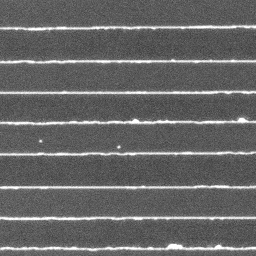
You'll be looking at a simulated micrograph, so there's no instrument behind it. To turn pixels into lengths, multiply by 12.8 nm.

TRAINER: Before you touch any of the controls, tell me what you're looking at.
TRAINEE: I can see lines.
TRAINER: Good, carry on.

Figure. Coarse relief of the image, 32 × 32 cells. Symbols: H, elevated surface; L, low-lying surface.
HHHHHHHHHHHHHHHHHHHHHHHHHHHHHHHH
HHHHHHHHHHHHHHHHHHHHHHHHHHHHHHHH
HHHHHHHHHHHHHHHHHHHHHHHHHHHHHHHH
HHHHHHHHHHHHHHHHHLLHLLLLLLLLLLLL
LLLLLLLLLLLLLLLLLLLLLLLLLLLLLLLL
LLLLLLLLLLLLLLLLLLLLLLLLLLLLLLLL
LLLLLLLLLLLLLLLLLLLLLLLLLLLLLLLL
LLLLLLLLLLLLLLLLLLLLLLLLLLLLLLLL
HHHHHHHHHHHHHHHHHHHHHHHHHHHHHHHH
HHHHHHHHHHHHHHHHHHHHHHHHHHHHHHHH
HHHHHHHHHHHHHHHHHHHHHHHHHHHHHHHH
HHHHHHHHHHHHHHHHHHHHHHHHHHHHHLHH
LLLLLLLLLLLLLLLLLLLLLLLLLLLLLLLL
LLLLLLLLLLLLLLLLLLLLLLLLLLLLLLLL
LLLLLLLLLLLLLLLLLLLLLLLLLLLLLLLL
HHHHHHHHHHHHHHHHHHHHHHHHHHHHHHHH
HHHHHHHHHHHHHHHHHHHHHHHHHHHHHHHH
HHHHHHHHHHHHHHHHHHHHHHHHHHHHHHHH
HHHHHHHHHHHHHHHHHHHHHHHHHHHHHHHH
LLLLLLLLLLLLLLLLLLLLLLLLLLLLLLLL
LLLLLLLLLLLLLLLLLLLLLLLLLLLLLLLL
LLLLLLLLLLLLLLLLLLLLLLLLLLLLLLLL
LLLLLLLLLLLLLLLLLLLLLLLLLLLLLLLL
HHHHHHHHHHHHHHHHHHHHHHHHHHHHHHHH
HHHHHHHHHHHHHHHHHHHHHHHHHHHHHHHH
HHHHHHHHHHHHHHHHHHHHHHHHHHHHHHHH
HHHHHHHHHHHHHHHHHHHHHHHHHHHHHHHH
LLLLLLLLLLLLLLLLLLLLLLLLLLLLLLLL
LLLLLLLLLLLLLLLLLLLLLLLLLLLLLLLL
LLLLLLLLLLLLLLLLLLLLLLLLLLLLLLLL
LLLLLLLLLLLLLLLLLLLLLLLLLLLLLLLL
HHHHHHHHHHHHHHHHHHHHHHHHHHHHHHHH